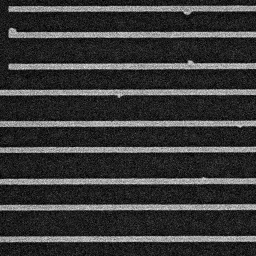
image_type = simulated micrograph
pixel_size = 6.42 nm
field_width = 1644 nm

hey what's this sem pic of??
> parallel lines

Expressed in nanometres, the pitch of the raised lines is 185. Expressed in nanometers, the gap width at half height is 152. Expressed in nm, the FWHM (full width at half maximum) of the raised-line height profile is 32.9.